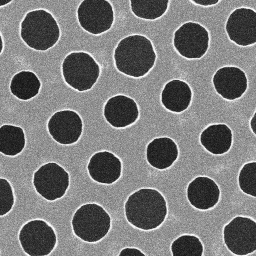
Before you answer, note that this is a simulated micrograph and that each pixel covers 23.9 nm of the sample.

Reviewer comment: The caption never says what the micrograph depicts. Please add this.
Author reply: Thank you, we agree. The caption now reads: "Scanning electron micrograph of a regular array of holes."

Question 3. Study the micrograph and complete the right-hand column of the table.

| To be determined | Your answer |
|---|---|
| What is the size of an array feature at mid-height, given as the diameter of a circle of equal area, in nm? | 818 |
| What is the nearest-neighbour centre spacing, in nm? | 1350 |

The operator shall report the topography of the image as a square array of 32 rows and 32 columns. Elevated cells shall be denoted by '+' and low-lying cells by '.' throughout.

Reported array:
.+++++++++....++.....++++..+++++
++++..++++....+++....++++++++...
+++....+++....++++++++++++++....
+++....+++....++++++++....++....
+++....+++++++++..++++....+++...
+++....++++++++....+++....++++..
++++++++++++++.....+++....++++++
++++++++....++.....+++++++++++++
++++++++....+++....+++++++++..++
++...+++....++++..+++++++++....+
+....++++...+++++++++..++++....+
+....+++++++++++++++....+++....+
++++++++++++++...+++....++++++++
+++++++++++++....++++..+++++++++
+++++++...+++....+++++++++++++++
++++++....++++..+++++++++++++++.
...+++....+++++++++++++++....+++
...++++...+++++++++..++++....+++
...+++++++++++++++....++++...+++
++++++++++++..++++....++++++++++
++++++.++++....++++...+++++++++.
+++++...+++....+++++++++++++++..
.+++.....+++...+++++++++...+++..
.+++....+++++++++++++++....+++..
..+++...++++++++....+++....+++++
..+++++++++.++++.....+++...+++++
.++++++++....+++.....+++++++++++
++++.++++.....++.....++++++++...
+++...+++.....+++..+++++++++....
++.....+++...++++++++++.++++....
+++....+++++++++++++++...+++....
+++...+++++++++...++++...++++...